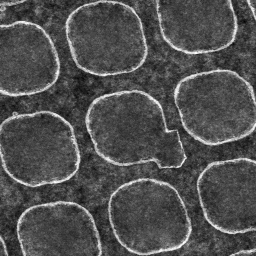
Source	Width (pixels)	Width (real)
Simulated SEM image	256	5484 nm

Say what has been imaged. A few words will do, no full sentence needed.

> raised bodies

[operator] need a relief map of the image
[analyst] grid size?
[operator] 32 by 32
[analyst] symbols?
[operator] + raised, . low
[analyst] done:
+..........++++.....+++++++++..+
.........++++++++...+++++++++...
.........++++++++...+++++++++...
+++++...++++++++++..+++++++++...
++++++..++++++++++..+++++++++...
++++++...+++++++++...++++++++...
+++++++..+++++++++.....++.......
+++++++..+++++++++..............
+++++++...+++++++...............
+++++++.................++++++..
++++++................+++++++++.
+++++...........+.....+++++++++.
............+++++++...++++++++++
...........+++++++++..++++++++++
...++++....+++++++++...+++++++++
+++++++++..++++++++++..+++++++++
+++++++++..+++++++++++..+++++++.
+++++++++...++++++++++...++++...
++++++++++..+++++++++++.........
++++++++++...++++++++++.........
.+++++++++.....+....+++....+++++
.++++++++................+++++++
..++++++..........+......+++++++
...............+++++++...+++++++
..............++++++++...+++++++
.......++.....+++++++++..+++++++
...++++++++...+++++++++...++++++
..++++++++++..++++++++++..++++++
..++++++++++..++++++++++...+++++
..++++++++++...+++++++++........
...+++++++++...++++++++.........
+..+++++++++.....++...........++